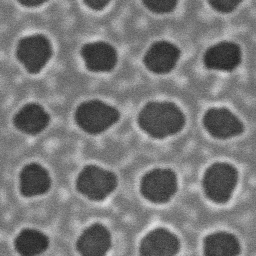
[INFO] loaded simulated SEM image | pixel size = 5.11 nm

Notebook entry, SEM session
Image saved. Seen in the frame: a regular array of holes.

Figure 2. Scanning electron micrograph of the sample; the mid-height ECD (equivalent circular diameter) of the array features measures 0.2 micrometres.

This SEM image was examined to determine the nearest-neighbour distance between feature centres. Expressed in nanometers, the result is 314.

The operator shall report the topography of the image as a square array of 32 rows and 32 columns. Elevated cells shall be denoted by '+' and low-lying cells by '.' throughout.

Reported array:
++....++++....++++....++++....++
+++++++++++++++++++..++++++..+++
++++++++++++++++++++++++++++++++
++++++++++++++++++++++++++++++++
+++...++++++++++++++++++++++++++
++.....+++....+++++...+++++...++
++.....+++.....+++.....+++....++
++....++++.....+++....+++.....++
+++...+++++...++++....++++....++
++++++++++++++++++++++++++++++++
++++++++++++++++++++++++++++++++
++++++++++++++++++++++++++++++++
+++++++++++..+++++++++++++++++++
+++...+++......+++.....+++...+++
++....+++......++......++.....++
++....+++.....+++......++.....++
+++..+++++...+++++.....+++.....+
++++++++++++++++++++++++++++++++
++++++++++++++++++++++++++++++++
++++++++++++++++++++++++++++++++
+++..++++++.++++++++++++++...+++
++....++++....++++....+++.....++
++.....++......++.....+++.....++
++....+++......++.....+++.....++
+++..+++++....++++....++++...+++
+++++++++++++++++++..++++++.++++
++++++++++++++++++++++++++++++++
++++++++++++++++++++++++++++++++
+++.+++++++..++++++..+++++++++++
++....++++....++++....++++....++
++....+++.....+++......++.....++
++....++++....+++......++.....++